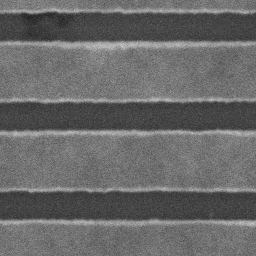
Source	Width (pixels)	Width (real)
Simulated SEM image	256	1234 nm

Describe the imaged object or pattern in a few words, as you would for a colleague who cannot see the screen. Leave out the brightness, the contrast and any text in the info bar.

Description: lines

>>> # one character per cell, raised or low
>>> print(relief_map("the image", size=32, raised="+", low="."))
++++++++++++++++++++++++++++++++
++++++.+++..++++++++++++++++++++
................................
................................
................................
++++++++++++++++++++++++++++++++
++++++++++++++++++++++++++++++++
++++++++++++++++++++++++++++++++
++++++++++++++++++++++++++++++++
++++++++++++++++++++++++++++++++
++++++++++++++++++++++++++++++++
++++++++++++++++++++++++++++++++
++++++++++++++++++++++++++++++++
................................
................................
................................
++++++++++++++++++++++++++++++++
++++++++++++++++++++++++++++++++
++++++++++++++++++++++++++++++++
++++++++++++++++++++++++++++++++
++++++++++++++++++++++++++++++++
++++++++++++++++++++++++++++++++
++++++++++++++++++++++++++++++++
++++++++++++++++++++++++++++++++
................................
................................
................................
................................
++++++++++++++++++++++++++++++++
++++++++++++++++++++++++++++++++
++++++++++++++++++++++++++++++++
++++++++++++++++++++++++++++++++